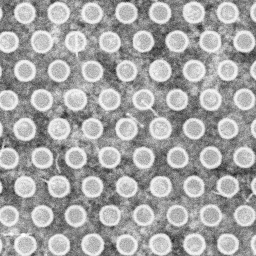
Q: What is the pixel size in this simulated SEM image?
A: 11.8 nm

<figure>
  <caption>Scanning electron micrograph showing a regular array of raised bodies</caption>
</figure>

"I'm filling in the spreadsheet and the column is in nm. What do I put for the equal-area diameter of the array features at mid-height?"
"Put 227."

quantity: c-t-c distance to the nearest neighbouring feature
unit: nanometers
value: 391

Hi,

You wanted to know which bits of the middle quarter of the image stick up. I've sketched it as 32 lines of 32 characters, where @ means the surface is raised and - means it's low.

@----@@@@-----@@@-----@@@@----@@
@----@@@@-----@@@@----@@@@@---@@
@----@@@@-----@@@@----@@@@----@@
------@@@-----@@@------@@@-----@
--------------------------------
--------------------------------
--------------------------------
-@@@@----@@@@-----@@@@----@@@@--
-@@@@----@@@@@----@@@@----@@@@--
-@@@@----@@@@@----@@@@----@@@@--
-@@@@-----@@@-----@@@@-----@@@--
--------------------------------
--------------------------------
--------------------------------
-----@@@@-----@@@-----@@@@-----@
@----@@@@----@@@@@----@@@@----@@
@----@@@@----@@@@@----@@@@@---@@
@----@@@@-----@@@@----@@@@-----@
---------------@----------------
--------------------------------
--------------------------------
--@@------@@@------@@------@@---
-@@@@----@@@@@----@@@@----@@@@@-
-@@@@----@@@@@----@@@@----@@@@@-
-@@@@----@@@@-----@@@@----@@@@@-
--@@-------@-------@@-------@---
--------------------------------
--------------------------------
------@@-------@-------@@-------
@----@@@@-----@@@@----@@@@-----@
@----@@@@-----@@@@----@@@@----@@
@----@@@@-----@@@@----@@@@----@@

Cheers